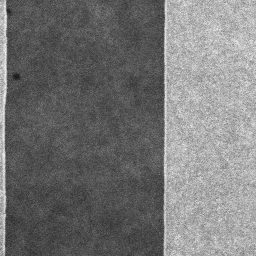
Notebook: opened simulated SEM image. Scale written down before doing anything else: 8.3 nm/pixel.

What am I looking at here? one or a few lines or trenches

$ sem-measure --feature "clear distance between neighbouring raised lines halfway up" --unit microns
1.33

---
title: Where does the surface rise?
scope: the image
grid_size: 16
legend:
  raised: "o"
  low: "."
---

..........oooooo
..........oooooo
..........oooooo
..........oooooo
..........oooooo
..........oooooo
..........oooooo
..........oooooo
..........oooooo
..........oooooo
..........oooooo
..........oooooo
..........oooooo
..........oooooo
..........oooooo
..........oooooo